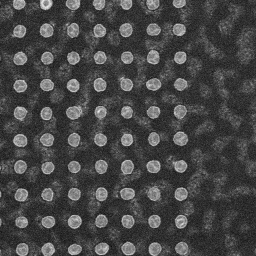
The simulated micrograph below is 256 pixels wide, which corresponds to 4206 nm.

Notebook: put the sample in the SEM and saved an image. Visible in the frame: a regular array of raised bodies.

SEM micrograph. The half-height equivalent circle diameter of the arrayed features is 199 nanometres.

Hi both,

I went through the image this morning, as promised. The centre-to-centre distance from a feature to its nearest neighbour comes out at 433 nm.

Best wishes